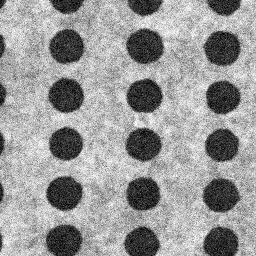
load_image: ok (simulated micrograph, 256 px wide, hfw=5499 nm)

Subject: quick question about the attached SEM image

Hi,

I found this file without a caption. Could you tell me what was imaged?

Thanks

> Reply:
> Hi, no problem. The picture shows a regular array of holes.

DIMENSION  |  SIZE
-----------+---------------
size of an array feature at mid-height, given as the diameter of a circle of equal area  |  0.77 microns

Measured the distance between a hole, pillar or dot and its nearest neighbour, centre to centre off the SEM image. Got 1050 nm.